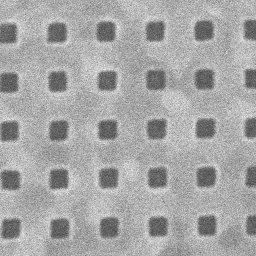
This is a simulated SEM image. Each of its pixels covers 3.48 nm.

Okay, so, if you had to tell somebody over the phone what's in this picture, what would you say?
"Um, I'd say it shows a regular array of holes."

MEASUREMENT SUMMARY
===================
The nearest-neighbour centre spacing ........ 169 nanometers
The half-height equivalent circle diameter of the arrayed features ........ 77.4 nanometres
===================